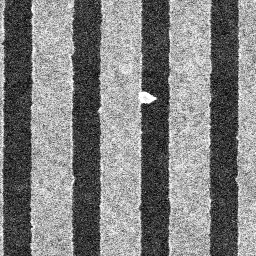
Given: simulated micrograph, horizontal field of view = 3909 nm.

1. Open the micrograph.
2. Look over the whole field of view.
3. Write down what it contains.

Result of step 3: one or a few lines or trenches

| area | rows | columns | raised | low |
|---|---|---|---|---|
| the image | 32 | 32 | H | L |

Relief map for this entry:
LLLLHHHHHLLLLHHHHHLLLHHHHHLLLLHH
LLLLHHHHHLLLLHHHHHLLLHHHHHLLLLHH
LLLLHHHHHLLLLHHHHHLLLHHHHHLLLLHH
LLLLHHHHHLLLLHHHHHLLLHHHHHLLLLHH
LLLLHHHHHLLLLHHHHHLLLHHHHHLLLLHH
LLLLHHHHHLLLLHHHHHLLLHHHHHLLLLHH
LLLLHHHHHLLLLHHHHHLLLHHHHHLLLLHH
LLLLHHHHHLLLLHHHHHLLLHHHHHLLLLHH
LLLLHHHHHLLLLHHHHHLLLHHHHHLLLLHH
LLLLHHHHHLLLLHHHHHLLLHHHHHLLLLHH
LLLLHHHHHLLLLHHHHHLLLHHHHHLLLLHH
LLLLHHHHHLLLLHHHHHLLLHHHHHHLLLHH
LLLLHHHHHLLLLHHHHHHLLHHHHHLLLLHH
LLLLHHHHHLLLLHHHHLLLLHHHHHLLLLHH
LLLLHHHHHLLLHHHHHHLLLHHHHHLLLLHH
LLLLHHHHHLLLLHHHHHLLLHHHHHLLLLHH
LLLLHHHHHLLLLHHHHHLLLHHHHHLLLLHH
LLLLHHHHHLLLLHHHHHLLLHHHHHLLLLHH
LLLLHHHHHLLLLHHHHHLLLHHHHHLLLLHH
LLLLHHHHHLLLLHHHHHLLLHHHHHLLLLHH
LLLLHHHHHLLLLHHHHHLLLHHHHHLLLLHH
LLLLHHHHHLLLLHHHHHLLLHHHHHLLLLHH
LLLLHHHHHLLLLHHHHHLLLHHHHHLLLLHH
LLLLHHHHHLLLLHHHHHLLLHHHHHLLLLHH
LLLLHHHHHLLLLHHHHHLLLHHHHHLLLLHH
LLLLHHHHHLLLLHHHHLLLLHHHHHLLLLHH
LLLLHHHHHLLLLHHHHLLLLHHHHHLLLLHH
LLLLHHHHHLLLLHHHHHLLLHHHHHLLLLHH
LLLLHHHHHLLLLHHHHHLLLHHHHHLLLLHH
LLLLHHHHHLLLLHHHHLLLLHHHHHLLLLHH
LLHLHHHHHLLLLHHHHLLLLHHHHHLLLLHH
LLLLHHHHHLLLLHHHHHLLLHHHHHLLLLHH